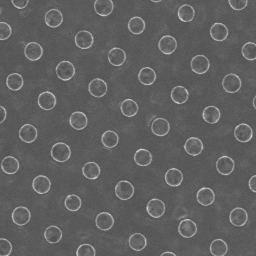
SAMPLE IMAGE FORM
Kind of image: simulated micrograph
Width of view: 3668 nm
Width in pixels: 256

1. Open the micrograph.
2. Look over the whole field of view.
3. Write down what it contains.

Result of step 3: a regular array of raised bodies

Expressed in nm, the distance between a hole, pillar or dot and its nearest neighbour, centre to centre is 523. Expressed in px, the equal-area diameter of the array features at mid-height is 17.6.